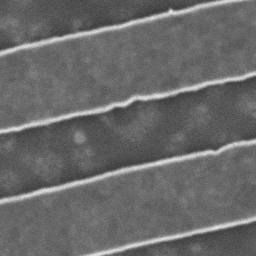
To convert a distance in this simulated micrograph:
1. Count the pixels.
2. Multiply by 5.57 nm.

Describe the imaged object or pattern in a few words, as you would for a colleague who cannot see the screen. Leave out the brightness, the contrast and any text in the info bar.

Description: one or a few lines or trenches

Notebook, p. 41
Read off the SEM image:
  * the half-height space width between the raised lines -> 363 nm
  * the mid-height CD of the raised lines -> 0.429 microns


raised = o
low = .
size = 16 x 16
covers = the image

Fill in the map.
............oooo
........oooooooo
...ooooooooooooo
oooooooooooooooo
oooooooooooooooo
oooooooooooo....
oooooooo........
ooo.............
................
.............ooo
........oooooooo
.....ooooooooooo
oooooooooooooooo
oooooooooooooooo
oooooooooooo....
oooooooo........